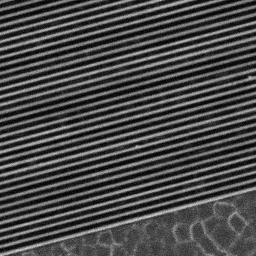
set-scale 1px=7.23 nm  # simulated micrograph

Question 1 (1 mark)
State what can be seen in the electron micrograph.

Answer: parallel lines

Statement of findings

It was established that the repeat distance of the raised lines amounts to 55.2 nanometers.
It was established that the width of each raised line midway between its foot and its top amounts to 21 nanometres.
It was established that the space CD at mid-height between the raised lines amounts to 35 nanometers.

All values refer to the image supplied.